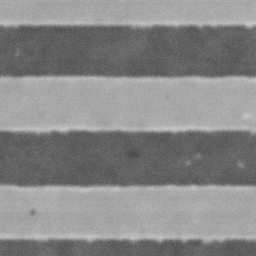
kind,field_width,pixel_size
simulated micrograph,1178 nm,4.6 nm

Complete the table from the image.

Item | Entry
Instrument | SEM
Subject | lines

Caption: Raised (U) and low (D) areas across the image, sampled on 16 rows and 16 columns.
UUUUUUUUUUUUUUUU
UUUUUUUUUUUUUUUU
DDDDDDDDDDDDDDDD
DDDDDDDDDDDDDDDD
DDDDDDDDDDDDDDDD
UUUUUUUUUUUUUUUU
UUUUUUUUUUUUUUUU
UUUUUUUUUUUUUUUU
DDDDDDDDDDDDDDDD
DDDDDDDDDDDDDDDD
DDDDDDDDDDDDDDDD
DDDDDDDDDDDDDDDD
UUUUUUUUUUUUUUUU
UUUUUUUUUUUUUUUU
UUUUUUUUUUUUUUUU
DDDDDDDDDDDDDDDD